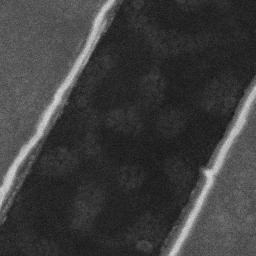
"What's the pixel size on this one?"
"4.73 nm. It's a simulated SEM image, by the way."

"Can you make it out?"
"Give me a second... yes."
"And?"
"one or a few lines or trenches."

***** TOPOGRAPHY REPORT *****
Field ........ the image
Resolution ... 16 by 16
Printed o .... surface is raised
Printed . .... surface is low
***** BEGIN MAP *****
ooooooo.........
oooooo..........
oooooo..........
ooooo...........
ooooo...........
oooo............
ooo............o
ooo............o
oo............oo
oo............oo
o............ooo
o............ooo
.............ooo
............oooo
............oooo
...........ooooo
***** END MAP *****